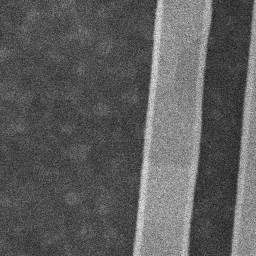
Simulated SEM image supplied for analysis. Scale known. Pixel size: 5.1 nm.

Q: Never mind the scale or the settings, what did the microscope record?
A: one or a few lines or trenches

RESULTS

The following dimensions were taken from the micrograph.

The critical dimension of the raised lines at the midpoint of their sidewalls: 240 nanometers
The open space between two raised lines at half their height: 251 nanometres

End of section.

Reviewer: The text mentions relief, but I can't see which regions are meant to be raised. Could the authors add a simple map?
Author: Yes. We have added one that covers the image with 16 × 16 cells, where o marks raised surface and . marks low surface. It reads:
..........ooo...
..........ooo...
..........ooo...
..........ooo...
..........ooo...
..........oo....
.........ooo...o
.........ooo...o
.........ooo...o
.........ooo...o
.........ooo...o
.........ooo...o
.........ooo...o
.........ooo...o
.........ooo...o
.........ooo...o